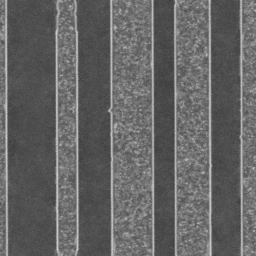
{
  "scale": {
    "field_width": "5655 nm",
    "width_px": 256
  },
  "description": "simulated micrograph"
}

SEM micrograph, one or a few lines or trenches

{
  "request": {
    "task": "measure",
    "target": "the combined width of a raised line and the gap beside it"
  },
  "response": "1.39 microns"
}